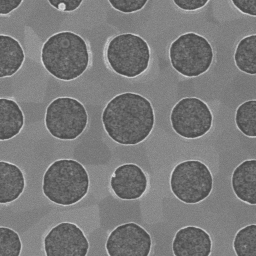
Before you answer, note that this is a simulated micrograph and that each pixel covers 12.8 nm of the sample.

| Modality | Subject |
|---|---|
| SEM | a regular array of holes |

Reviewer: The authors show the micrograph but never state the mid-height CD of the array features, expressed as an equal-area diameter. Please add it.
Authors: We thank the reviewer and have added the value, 545 nanometers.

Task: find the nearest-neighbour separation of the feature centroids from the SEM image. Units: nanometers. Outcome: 798